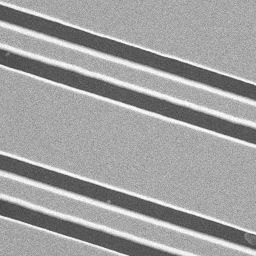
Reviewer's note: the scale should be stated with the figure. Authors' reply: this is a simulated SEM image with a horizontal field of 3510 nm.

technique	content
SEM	lines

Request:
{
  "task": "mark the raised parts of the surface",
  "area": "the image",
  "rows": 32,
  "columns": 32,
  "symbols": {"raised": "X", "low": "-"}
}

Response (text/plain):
XXXXXXXXXXXXXXXXXXXXXXXXXXXXXXXX
---XXXXXXXXXXXXXXXXXXXXXXXXXXXXX
------XXXXXXXXXXXXXXXXXXXXXXXXXX
XXX------XXXXXXXXXXXXXXXXXXXXXXX
XXXXXX------XXXXXXXXXXXXXXXXXXXX
XXXXXXXXX-------XXXXXXXXXXXXXXXX
-XXXXXXXXXXX-------XXXXXXXXXXXXX
-----XXXXXXXXXXX------XXXXXXXXXX
X-------XXXXXXXXXXX------XXXXXXX
XXXXX------XXXXXXXXXXX------XXXX
XXXXXXXX------XXXXXXXXXXXX------
XXXXXXXXXXX------XXXXXXXXXXXX---
XXXXXXXXXXXXXX-------XXXXXXXXXXX
XXXXXXXXXXXXXXXXX-------XXXXXXXX
XXXXXXXXXXXXXXXXXXXXX------XXXXX
XXXXXXXXXXXXXXXXXXXXXXXX------XX
XXXXXXXXXXXXXXXXXXXXXXXXXXX-----
XXXXXXXXXXXXXXXXXXXXXXXXXXXXXX--
XXXXXXXXXXXXXXXXXXXXXXXXXXXXXXXX
-XXXXXXXXXXXXXXXXXXXXXXXXXXXXXXX
----XXXXXXXXXXXXXXXXXXXXXXXXXXXX
X------XXXXXXXXXXXXXXXXXXXXXXXXX
XXXX------XXXXXXXXXXXXXXXXXXXXXX
XXXXXXX------XXXXXXXXXXXXXXXXXXX
XXXXXXXXXX-------XXXXXXXXXXXXXXX
--XXXXXXXXXXXX------XXXXXXXXXXXX
-----XXXXXXXXXXXX------XXXXXXXXX
XX------XXXXXXXXXXXX------XXXXXX
XXXXX------XXXXXXXXXXXX------XXX
XXXXXXXX-------XXXXXXXXXXX------
XXXXXXXXXXXX------XXXXXXXXXXXX--
XXXXXXXXXXXXXXX------XXXXXXXXXXX